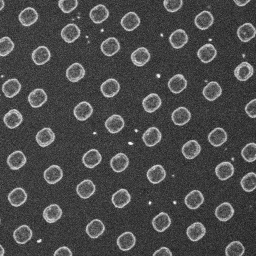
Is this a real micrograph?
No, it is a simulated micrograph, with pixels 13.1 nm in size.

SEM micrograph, a regular array of raised bodies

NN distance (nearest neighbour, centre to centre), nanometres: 439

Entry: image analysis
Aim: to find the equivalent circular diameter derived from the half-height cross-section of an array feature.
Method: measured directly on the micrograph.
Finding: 230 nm